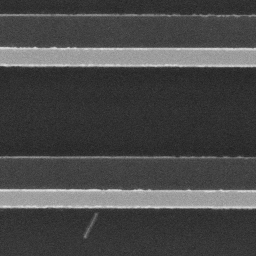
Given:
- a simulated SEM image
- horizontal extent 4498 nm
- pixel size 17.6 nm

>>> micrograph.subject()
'lines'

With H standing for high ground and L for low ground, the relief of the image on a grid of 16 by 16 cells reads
LLLLLLLLLLLLLLLL
HHHHHHHHHHHHHHHH
HHHHHHHHHHHHHHHH
HHHHHHHHHHHHHHHH
LLLLLLLLLLLLLLLL
LLLLLLLLLLLLLLLL
LLLLLLLLLLLLLLLL
LLLLLLLLLLLLLLLL
LLLLLLLLLLLLLLLL
LLLLLLLLLLLLLLLL
HHHHHHHHHHHHHHHH
HHHHHHHHHHHHHHHH
HHHHHHHHHHHHHHHH
LLLLLLLLLLLLLLLL
LLLLLLLLLLLLLLLL
LLLLLLLLLLLLLLLL